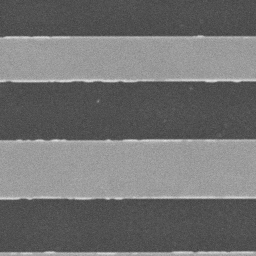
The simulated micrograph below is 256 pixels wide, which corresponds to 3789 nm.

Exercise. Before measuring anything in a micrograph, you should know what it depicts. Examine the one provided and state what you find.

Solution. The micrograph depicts lines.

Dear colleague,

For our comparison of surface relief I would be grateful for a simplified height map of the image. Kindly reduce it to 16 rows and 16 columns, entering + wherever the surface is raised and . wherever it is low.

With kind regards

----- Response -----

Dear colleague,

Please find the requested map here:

................
................
++++++++++++++++
++++++++++++++++
++++++++++++++++
................
................
................
................
++++++++++++++++
++++++++++++++++
++++++++++++++++
................
................
................
................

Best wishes